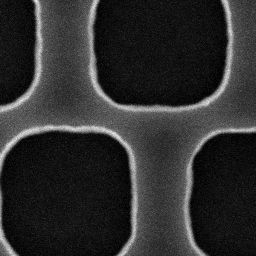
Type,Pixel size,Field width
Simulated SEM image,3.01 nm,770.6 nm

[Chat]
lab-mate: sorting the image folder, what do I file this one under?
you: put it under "holes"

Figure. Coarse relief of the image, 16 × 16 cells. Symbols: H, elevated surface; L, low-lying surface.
LLHHHHLLLLLLLLHH
LLHHHHLLLLLLLLHH
LLHHHHLLLLLLLLHH
LLHHHHLLLLLLLLHH
LLHHHHLLLLLLLLHH
LLHHHHLLLLLLLLHH
LHHHHHHLLLLLHHHH
HHHHHHHHHHHHHHHH
HHLLLLLHHHHHHLLL
LLLLLLLLHHHHLLLL
LLLLLLLLHHHHLLLL
LLLLLLLLHHHHLLLL
LLLLLLLLHHHHLLLL
LLLLLLLLHHHHLLLL
LLLLLLLLHHHHLLLL
HLLLLLLLHHHHLLLL